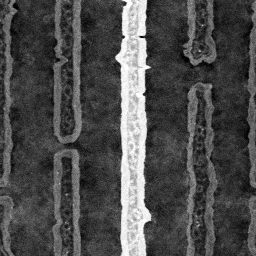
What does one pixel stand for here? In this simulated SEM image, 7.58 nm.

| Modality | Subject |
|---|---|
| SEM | one or a few lines or trenches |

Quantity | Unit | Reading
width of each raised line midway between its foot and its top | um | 0.141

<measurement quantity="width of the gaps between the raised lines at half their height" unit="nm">362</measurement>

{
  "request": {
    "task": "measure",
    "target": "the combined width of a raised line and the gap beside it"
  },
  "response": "505 nm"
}